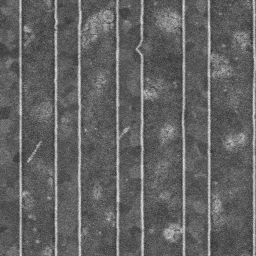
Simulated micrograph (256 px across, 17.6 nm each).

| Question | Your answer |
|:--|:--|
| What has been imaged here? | one or a few lines or trenches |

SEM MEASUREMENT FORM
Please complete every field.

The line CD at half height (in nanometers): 436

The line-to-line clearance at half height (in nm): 683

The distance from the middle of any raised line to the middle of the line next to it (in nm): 1140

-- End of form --